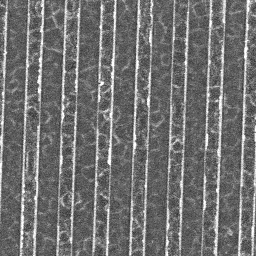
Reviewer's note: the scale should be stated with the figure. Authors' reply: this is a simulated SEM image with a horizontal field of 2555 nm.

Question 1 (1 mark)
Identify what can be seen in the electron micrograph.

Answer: parallel lines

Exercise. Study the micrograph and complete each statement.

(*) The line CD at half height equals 151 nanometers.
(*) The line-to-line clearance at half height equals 209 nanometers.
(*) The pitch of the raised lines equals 362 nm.